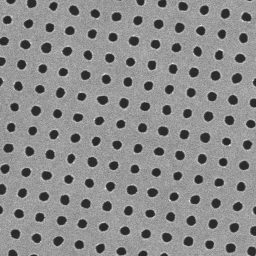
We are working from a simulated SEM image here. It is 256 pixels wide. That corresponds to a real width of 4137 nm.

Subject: a regular array of holes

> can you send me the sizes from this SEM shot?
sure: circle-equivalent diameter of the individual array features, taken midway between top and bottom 149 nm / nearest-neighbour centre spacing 335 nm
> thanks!